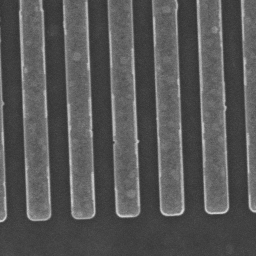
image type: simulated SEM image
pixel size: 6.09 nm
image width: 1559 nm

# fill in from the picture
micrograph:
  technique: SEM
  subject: parallel lines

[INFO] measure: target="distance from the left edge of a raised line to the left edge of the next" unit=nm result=271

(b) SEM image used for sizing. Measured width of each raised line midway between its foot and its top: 144 nanometers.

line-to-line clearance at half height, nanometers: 128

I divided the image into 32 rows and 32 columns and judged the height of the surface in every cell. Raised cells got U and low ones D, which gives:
DDDUUDDDUUUDDDUUDDDUUUDDDUUUDDUU
DDDUUDDDUUUDDDUUDDDUUUDDDUUUDDUU
DDDUUDDDUUUDDDUUDDDUUUDDDUUUDDUU
DDDUUDDDUUUDDDUUUDDUUUDDDUUUDDUU
DDDUUDDDUUUDDDUUUDDUUUDDDUUUDDUU
DDDUUUDDUUUDDDUUUDDUUUDDDUUUDDUU
DDDUUUDDUUUDDDUUUDDUUUDDDUUUDDDU
DDDUUUDDUUUDDDUUUDDUUUDDDUUUDDDU
DDDUUUDDUUUDDDUUUDDUUUDDDUUUDDDU
DDDUUUDDUUUDDDUUUDDUUUDDDUUUDDDU
DDDUUUDDUUUDDDUUUDDUUUDDDUUUDDDU
DDDUUUDDUUUDDDUUUDDDUUDDDUUUDDDU
DDDUUUDDUUUDDDUUUDDDUUDDDUUUDDDU
DDDUUUDDUUUDDDUUUDDDUUDDDUUUDDDU
DDDUUUDDDUUDDDUUUDDDUUUDDUUUDDDU
DDDUUUDDDUUDDDUUUDDDUUUDDUUUDDDU
DDDUUUDDDUUUDDUUUDDDUUUDDUUUDDDU
DDDUUUDDDUUDDDUUUDDDUUUDDUUUDDDU
DDDUUUDDDUUUDDUUUDDDUUUDDUUUDDDU
DDDUUUDDDUUUDDUUUDDDUUUDDUUUDDDU
UDDUUUDDDUUUDDUUUDDDUUUDDUUUDDDU
UDDUUUDDDUUUDDUUUDDDUUUDDDUUDDDU
UDDUUUDDDUUUDDUUUDDDUUUDDDUUDDDU
UDDUUUDDDUUUDDUUUDDDUUUDDDUUDDDU
UDDUUUDDDUUUDDUUUDDDUUUDDDUUDDDU
UDDUUUDDDUUUDDUUUDDDUUUDDDUUUDDU
UDDUUUDDDUUUDDDUUDDDUUUDDDUUDDDD
DDDDDDDDDDDDDDDDDDDDDDDDDDDDDDDD
DDDDDDDDDDDDDDDDDDDDDDDDDDDDDDDD
DDDDDDDDDDDDDDDDDDDDDDDDDDDDDDDD
DDDDDDDDDDDDDDDDDDDDDDDDDDDDDDDD
DDDDDDDDDDDDDDDDDDDDDDDDDDDDDDDD